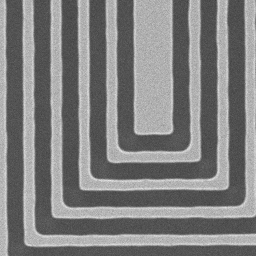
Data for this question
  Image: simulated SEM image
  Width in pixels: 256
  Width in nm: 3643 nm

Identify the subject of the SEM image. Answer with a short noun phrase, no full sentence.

groups of lines, slits or small figures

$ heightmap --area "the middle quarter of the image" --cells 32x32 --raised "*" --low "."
....**.....**.....*********.....
....**.....**.....*********.....
....**.....**.....*********.....
....**.....**.....*********.....
....**.....**.....*********.....
....**.....**.....*********.....
....**.....**.....*********.....
....**.....**.....*********.....
....**.....**.....*********.....
....**.....**.....*********.....
....**.....**.....*********.....
....**.....**.....*********.....
....**.....**.....*********.....
....**.....**.....*********.....
....**.....**.....*********.....
....**.....**.....*********.....
....**.....**.....*********.....
....**.....**.....****.***......
....**.....**...................
....**.....**...................
....**.....***.................*
....**.....***.................*
....**.....*********************
....**.....*********************
....**.....******.**********....
....**..........................
....**..........................
....***.........................
....***.........................
....****************************
....****************************
................................